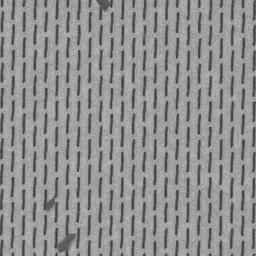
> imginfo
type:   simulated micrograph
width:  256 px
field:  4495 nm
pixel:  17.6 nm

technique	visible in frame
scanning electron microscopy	a regular array of holes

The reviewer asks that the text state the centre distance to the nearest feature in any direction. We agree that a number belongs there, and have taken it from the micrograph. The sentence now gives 0.288 um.